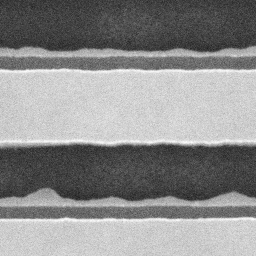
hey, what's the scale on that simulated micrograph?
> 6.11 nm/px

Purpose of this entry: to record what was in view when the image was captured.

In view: lines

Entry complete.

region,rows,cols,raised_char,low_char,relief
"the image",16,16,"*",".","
................
................
................
*......*********
****************
****************
****************
****************
****************
................
................
................
................
****************
****************
****************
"